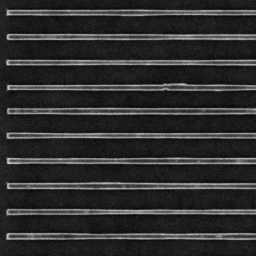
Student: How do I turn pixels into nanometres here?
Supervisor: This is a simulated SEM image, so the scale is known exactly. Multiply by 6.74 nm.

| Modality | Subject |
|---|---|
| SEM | parallel lines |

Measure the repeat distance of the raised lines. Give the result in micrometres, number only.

0.168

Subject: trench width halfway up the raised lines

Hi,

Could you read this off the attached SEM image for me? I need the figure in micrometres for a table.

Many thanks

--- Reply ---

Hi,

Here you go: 0.137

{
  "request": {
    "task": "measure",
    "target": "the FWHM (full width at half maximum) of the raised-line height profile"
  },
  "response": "32 nm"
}